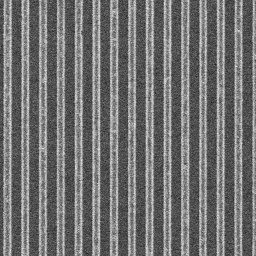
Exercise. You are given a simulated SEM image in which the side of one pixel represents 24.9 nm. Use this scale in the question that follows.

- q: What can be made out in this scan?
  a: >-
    parallel lines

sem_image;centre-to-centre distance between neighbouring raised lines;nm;441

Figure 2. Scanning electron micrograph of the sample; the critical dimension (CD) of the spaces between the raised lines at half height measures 304 nanometers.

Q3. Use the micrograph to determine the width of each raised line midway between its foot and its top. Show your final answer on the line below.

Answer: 152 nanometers